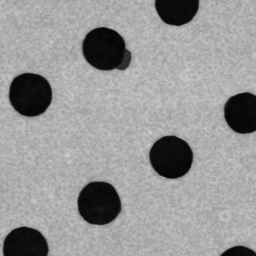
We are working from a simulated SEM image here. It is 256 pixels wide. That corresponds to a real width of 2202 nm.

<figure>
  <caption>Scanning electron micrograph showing holes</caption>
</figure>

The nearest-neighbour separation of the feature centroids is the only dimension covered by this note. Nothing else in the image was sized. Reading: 747 nm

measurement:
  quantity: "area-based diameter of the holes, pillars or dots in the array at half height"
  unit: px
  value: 43.5